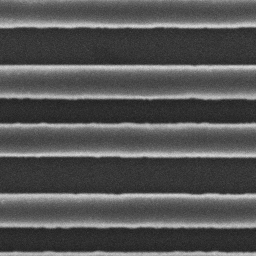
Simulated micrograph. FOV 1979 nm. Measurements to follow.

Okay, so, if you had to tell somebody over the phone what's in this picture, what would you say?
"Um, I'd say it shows lines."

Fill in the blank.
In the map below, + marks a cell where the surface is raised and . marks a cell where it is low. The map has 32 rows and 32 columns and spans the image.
++++++++++++++++++++++++++++++++
++++++++++++++++++++++++++++++++
++++++++++++++++++++++++++++++++
................................
................................
................................
................................
................................
++++++++++++++++++++++++++++++++
++++++++++++++++++++++++++++++++
++++++++++++++++++++++++++++++++
++++++++++++++++++++++++++++++++
................................
................................
................................
................+...............
++++++++++++++++++++++++++++++++
++++++++++++++++++++++++++++++++
++++++++++++++++++++++++++++++++
............................++++
................................
................................
................................
................................
++++++++++++++++++++++++++++++++
++++++++++++++++++++++++++++++++
++++++++++++++++++++++++++++++++
++++++++++++++++++++++++++++++++
................................
................................
................................
............+...................